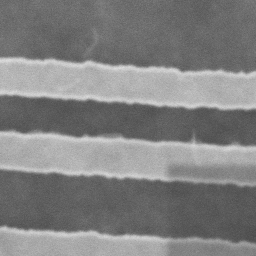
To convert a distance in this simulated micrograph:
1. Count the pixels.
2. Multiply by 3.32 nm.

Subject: lines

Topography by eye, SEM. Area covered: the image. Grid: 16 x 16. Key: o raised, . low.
................
................
................
................
oooooooooooooo..
oooooooooooooooo
.........ooooooo
................
oooo............
oooooooooooooooo
oooooooooooooooo
...............o
................
................
oooo.o..........
oooooooooooooooo